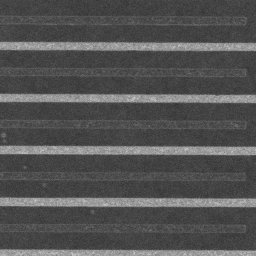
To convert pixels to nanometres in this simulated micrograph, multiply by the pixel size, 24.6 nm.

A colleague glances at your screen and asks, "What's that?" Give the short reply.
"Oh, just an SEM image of parallel lines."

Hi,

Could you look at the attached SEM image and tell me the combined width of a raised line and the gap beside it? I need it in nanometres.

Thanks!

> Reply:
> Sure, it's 639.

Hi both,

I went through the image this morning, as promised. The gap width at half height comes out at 449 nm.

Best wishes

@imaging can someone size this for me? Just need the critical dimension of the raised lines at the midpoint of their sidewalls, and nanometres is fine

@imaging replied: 184